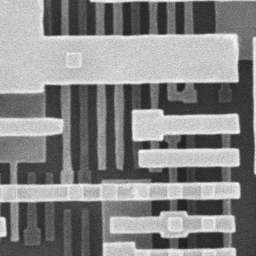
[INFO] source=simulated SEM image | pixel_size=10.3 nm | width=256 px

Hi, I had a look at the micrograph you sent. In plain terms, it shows wiring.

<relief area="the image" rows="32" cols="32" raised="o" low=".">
ooooo...........................
ooooo...........................
ooooo...........................
ooooo...........................
oooooo.......oo.oooooooooooooo..
oooooooooooooooooooooooooooooo..
oooooooooooooooooooooooooooooo..
oooooooooooooooooooooooooooooo..
oooooooooooooooooooooooooooooo..
oooooooooooooooooooooooooooooo..
oooooo.o........................
ooooo...........................
................................
................................
.................ooooooooooooo..
oooooooo.........ooooooooooooo..
oooooooo.........ooooooooooooo..
.................ooo............
................................
.................ooooooooooooo..
.................ooooooooooooo..
................................
................................
oooooooooooooooooooooooooooooo..
oooooooooooooooooooooooooooooo..
................................
....................ooo.........
o.............ooooooooooooooo...
o.............ooooooooooooooo...
....................ooo.........
.............oooo...............
.............oooooooooooooooo...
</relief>